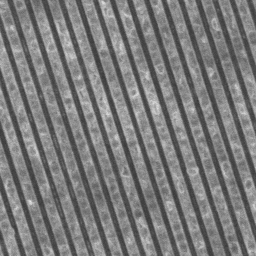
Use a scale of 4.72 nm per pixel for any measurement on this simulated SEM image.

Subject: parallel lines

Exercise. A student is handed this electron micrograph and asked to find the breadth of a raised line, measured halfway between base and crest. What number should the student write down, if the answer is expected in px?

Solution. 10.5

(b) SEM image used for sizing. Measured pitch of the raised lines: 76.8 nm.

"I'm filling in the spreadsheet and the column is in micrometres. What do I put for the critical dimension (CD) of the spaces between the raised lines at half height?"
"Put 0.0286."